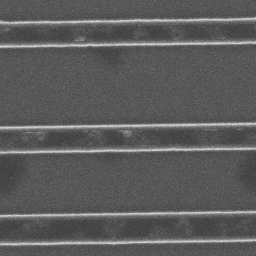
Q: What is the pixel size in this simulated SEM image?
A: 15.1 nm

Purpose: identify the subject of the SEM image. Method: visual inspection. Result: one or a few lines or trenches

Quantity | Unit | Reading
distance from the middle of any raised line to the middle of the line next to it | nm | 1470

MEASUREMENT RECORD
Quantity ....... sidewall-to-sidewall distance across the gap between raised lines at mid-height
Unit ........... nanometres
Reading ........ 1090